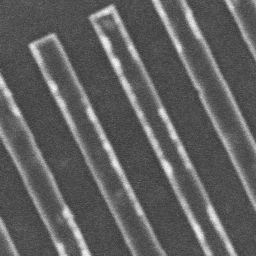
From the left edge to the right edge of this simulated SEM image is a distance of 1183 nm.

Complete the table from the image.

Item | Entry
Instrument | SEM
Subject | one or a few lines or trenches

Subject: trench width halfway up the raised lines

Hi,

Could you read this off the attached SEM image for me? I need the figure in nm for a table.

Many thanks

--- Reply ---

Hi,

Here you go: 178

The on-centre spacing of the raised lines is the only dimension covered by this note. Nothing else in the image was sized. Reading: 300 nanometres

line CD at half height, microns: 0.123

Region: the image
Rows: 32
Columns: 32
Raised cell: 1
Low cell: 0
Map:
00000000000000000001111000001111
00000000000001000000111100000111
00000000000111100000111100000011
00000000000011100000011110000011
00000010000011110000011110000011
00001110000001110000001111000001
00001111000001111000001111000000
00000111000000111000000111100000
00000111100000111100000111100000
00000011100000011100000011110000
00000011110000011110000011110000
10000001110000001110000001111000
11000001111000001111000001111000
11000000111000000111000000111100
11100000111100000111100000111100
11100000011100000011100000011110
11110000011110000011110000011110
11110000001110000001110000001111
01110000001111000001111000001111
01111000000111000000111000000111
00111100000111100000111100000111
00011100000011100000011100000011
00011110000011110000011110000011
00011110000001110000001110000001
00001111000001111000001111000001
00001111000000111000000111000000
00000111100000111100000111100000
00000111100000011100000011100000
10000011110000011110000011110000
10000011110000001110000001110000
11000001111000001111000001111000
11000001111000000111000000111000